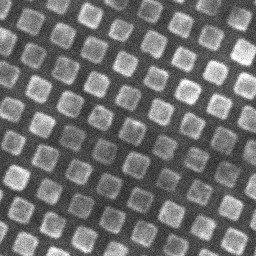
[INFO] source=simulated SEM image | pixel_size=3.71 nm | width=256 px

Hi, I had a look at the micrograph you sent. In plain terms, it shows a regular array of raised bodies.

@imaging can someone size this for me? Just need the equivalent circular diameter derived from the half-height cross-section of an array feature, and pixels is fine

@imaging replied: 22.8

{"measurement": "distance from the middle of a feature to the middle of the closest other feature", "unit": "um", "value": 0.124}